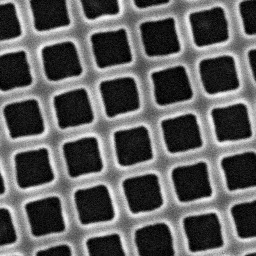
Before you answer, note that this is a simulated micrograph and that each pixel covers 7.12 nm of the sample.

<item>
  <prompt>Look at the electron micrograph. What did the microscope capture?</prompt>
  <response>a regular array of holes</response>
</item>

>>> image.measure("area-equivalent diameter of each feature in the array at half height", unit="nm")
292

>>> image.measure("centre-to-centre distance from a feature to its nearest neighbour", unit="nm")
349